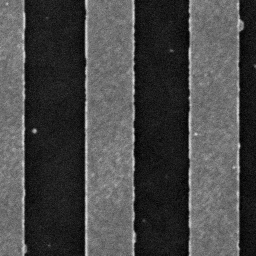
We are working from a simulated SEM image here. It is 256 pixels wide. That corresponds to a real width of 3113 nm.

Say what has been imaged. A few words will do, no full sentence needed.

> lines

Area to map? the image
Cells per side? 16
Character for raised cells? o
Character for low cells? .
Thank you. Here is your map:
oo...ooo....ooo.
oo...ooo....ooo.
o....ooo....ooo.
oo...ooo....ooo.
o....ooo....ooo.
oo...ooo....ooo.
oo...ooo....ooo.
o....ooo....ooo.
o....ooo....ooo.
o....ooo....ooo.
o....ooo....ooo.
oo...ooo....ooo.
oo...ooo....ooo.
o....ooo....ooo.
o....ooo....ooo.
o....ooo....ooo.